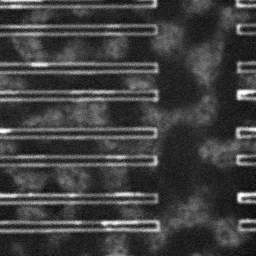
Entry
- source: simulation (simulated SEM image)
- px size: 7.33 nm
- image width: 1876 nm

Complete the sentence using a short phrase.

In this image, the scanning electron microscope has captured parallel lines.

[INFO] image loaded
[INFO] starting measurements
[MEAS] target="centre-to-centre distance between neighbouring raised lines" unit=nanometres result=239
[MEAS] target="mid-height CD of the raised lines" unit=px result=9.37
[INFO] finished